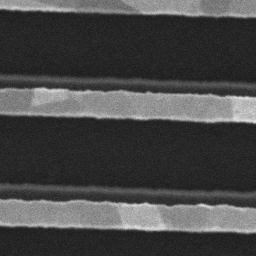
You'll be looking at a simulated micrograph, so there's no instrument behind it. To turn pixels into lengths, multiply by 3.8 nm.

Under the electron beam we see lines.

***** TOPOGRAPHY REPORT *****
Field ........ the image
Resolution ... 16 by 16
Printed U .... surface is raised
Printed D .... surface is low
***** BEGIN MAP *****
UUUUUUUUUUUUUUUU
DDDDDDDDDDDDDDDD
DDDDDDDDDDDDDDDD
DDDDDDDDDDDDDDDD
DDDDDDDDDDDDDDDD
UUUUUUUUUUUUUUUU
UUUUUUUUUUUUUUUU
DDDDDDDDDDDUUUUU
DDDDDDDDDDDDDDDD
DDDDDDDDDDDDDDDD
DDDDDDDDDDDDDDDD
DDDDDDDDDDDDDDDD
UUUUUUUUUUUUUUUU
UUUUUUUUUUUUUUUU
DDDDDDDDDDDDDDDU
DDDDDDDDDDDDDDDD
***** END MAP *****